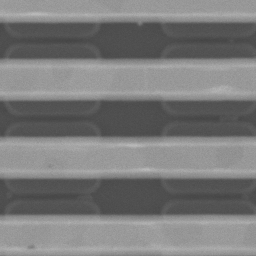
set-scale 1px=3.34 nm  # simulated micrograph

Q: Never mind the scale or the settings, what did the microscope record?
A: wiring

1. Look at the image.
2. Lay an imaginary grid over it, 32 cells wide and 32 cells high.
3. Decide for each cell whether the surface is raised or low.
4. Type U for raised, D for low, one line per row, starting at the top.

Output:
UUUUUUUUUUUUUUUUUUUUUUUUUUUUUUUU
UUUUUUUUUUUUUUUUUUUUUUUUUUUUUUUU
DDDDDDDDDDDDDDDDDDDDDDDDDDDDDDDD
DDDDDDDDDDDDDDDDDDDDDDDDDDDDDDDD
DDDDDDDDDDDDDDDDDDDDDDDDDDDDDDDD
DDDDDDDDDDDDDDDDDDDDDDDDDDDDDDDD
DDDDDDDDDDDDDDDDDDDDDDDDDDDDDDDD
DDDDDDDDDDDDDDDDDDDDDDDDDDDDDDDD
UUUUUUUUUUUUUUUUUUUUUUUUUUUUUUUU
UUUUUUUUUUUUUUUUUUUUUUUUUUUUUUUU
UUUUUUUUUUUUUUUUUUUUUUUUUUUUUUUU
UUUUUUUUUUUUUUUUUUUUUUUUUUUUUUUU
DDDDDDDDDDDDDDDDDDDDDDDDDDDDDDDD
DDDDDDDDDDDDDDDDDDDDDDDDDDDDDDDD
DDDDDDDDDDDDDDDDDDDDDDDDDDDDDDDD
DDDDDDDDDDDDDDDDDDDDDDDDDDDDDDDD
DDDDDDDDDDDDDDDDDDDDDDDDDDDDDDDD
DDDDDDDDDDDDDDDDDDDDUUDDDDDDDDUU
UUUUUUUUUUUUUUUUUUUUUUUUUUUUUUUU
UUUUUUUUUUUUUUUUUUUUUUUUUUUUUUUU
UUUUUUUUUUUUUUUUUUUUUUUUUUUUUUUU
UUUUUUUUUUUUUUUUUUUUUUUUUUUUUUUU
DDDDDDDDDDDDDDDDDDDDDDDDDDDDDDDD
DDDDDDDDDDDDDDDDDDDDDDDDDDDDDDDD
DDDDDDDDDDDDDDDDDDDDDDDDDDDDDDDD
DDDDDDDDDDDDDDDDDDDDDDDDDDDDDDDD
DDDDDDDDDDDDDDDDDDDDDDDDDDDDDDDD
UUUUUUUUUUUUUUUUUUUUUUUUUUUUUUUU
UUUUUUUUUUUUUUUUUUUUUUUUUUUUUUUU
UUUUUUUUUUUUUUUUUUUUUUUUUUUUUUUU
UUUUUUUUUUUUUUUUUUUUUUUUUUUUUUUU
UUUUUUUUUUUUUUUUUUUUUUUUUUUUUUUU